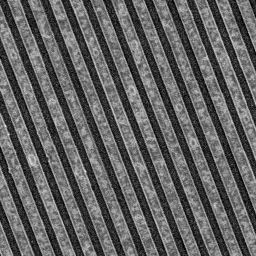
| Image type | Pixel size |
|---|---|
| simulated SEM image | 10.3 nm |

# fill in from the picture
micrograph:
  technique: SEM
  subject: parallel lines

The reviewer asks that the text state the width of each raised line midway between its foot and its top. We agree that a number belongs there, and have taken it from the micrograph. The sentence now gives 111 nm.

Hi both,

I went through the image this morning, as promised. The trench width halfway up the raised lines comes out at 83.1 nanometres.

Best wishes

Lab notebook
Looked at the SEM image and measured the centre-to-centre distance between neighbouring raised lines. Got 201 nm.